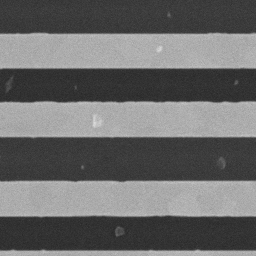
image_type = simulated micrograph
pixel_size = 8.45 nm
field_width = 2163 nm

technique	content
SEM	lines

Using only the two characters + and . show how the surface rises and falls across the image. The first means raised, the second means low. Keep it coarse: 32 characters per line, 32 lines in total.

................................
................................
................................
................................
++++++++++++++++++++++++++++++++
++++++++++++++++++++++++++++++++
++++++++++++++++++++++++++++++++
++++++++++++++++++++++++++++++++
+...............................
................................
................................
................................
................................
++++++++++++++++++++++++++++++++
++++++++++++++++++++++++++++++++
++++++++++++++++++++++++++++++++
++++++++++++++++++++++++++++++++
................................
................................
................................
................................
................................
................................
++++++++++++++++++++++++++++++++
++++++++++++++++++++++++++++++++
++++++++++++++++++++++++++++++++
++++++++++++++++++++++++++++++++
................................
................................
................................
................................
++++++++++++++++++++++++++++++++